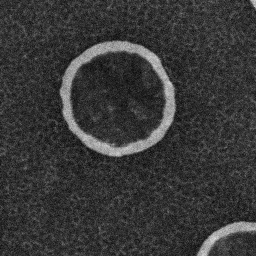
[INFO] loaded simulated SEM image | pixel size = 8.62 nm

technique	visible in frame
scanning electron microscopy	raised bodies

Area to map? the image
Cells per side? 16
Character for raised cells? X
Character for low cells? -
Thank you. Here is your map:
----------------
----------------
----------------
-----XXXX-------
----XXXXXX------
----XXXXXXX-----
----XXXXXXX-----
----XXXXXX------
-----XXXXX------
----------------
----------------
----------------
----------------
----------------
--------------XX
-------------XXX